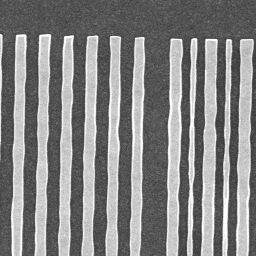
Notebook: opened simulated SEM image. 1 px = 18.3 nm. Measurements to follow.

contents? groups of lines, slits or small figures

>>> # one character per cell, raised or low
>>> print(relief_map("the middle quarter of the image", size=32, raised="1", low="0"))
11000011000011000011000000011000
11000011000011000011000000011000
11000011000011000011000000011000
11000011000011000011000000011000
11000011000011000111000000011000
11000011000011000111000000011000
11000011000011000111000000011000
11000011000011000111000000011000
11000011000011000111000000011000
11000011000011000111000000011000
11000011000011000111000000011000
11000011000111000111000000011000
11000011000111000111000000011000
11000011000011000111000000111000
11000111000011000110000000111000
11000111000010000110000000111000
11000111000110000110000000111000
11000111000110000110000000111000
11000111000110000010000000111000
11000111000111000110000000111000
11000111000111000110000000111000
11000111000111000110000000111000
11000111000111000110000000111001
11000111000111000110000000111001
11000110000110000110000000111001
11000110000110000110000000111000
11000111000110000110000000111001
11000111000110000110000000111001
10000111000110000110000000111001
10000110000110000110000000111000
10000110000110000110000000111000
10000110000110000110000000111000